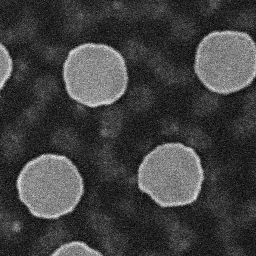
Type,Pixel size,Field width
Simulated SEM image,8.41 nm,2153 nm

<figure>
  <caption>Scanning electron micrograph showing raised bodies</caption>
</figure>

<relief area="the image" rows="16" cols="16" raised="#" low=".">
................
................
.............###
#...###.....####
#...####....####
....####.....##.
.....#..........
................
................
..........##....
..###....####...
.####....####...
.####.....##....
..##............
................
....##..........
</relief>